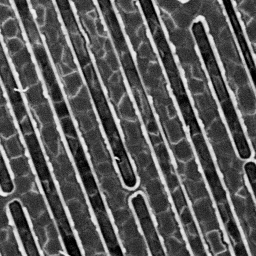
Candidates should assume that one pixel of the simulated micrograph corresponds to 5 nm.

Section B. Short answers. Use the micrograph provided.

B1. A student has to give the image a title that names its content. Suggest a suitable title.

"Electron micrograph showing parallel lines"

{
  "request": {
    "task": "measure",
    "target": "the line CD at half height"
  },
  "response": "130 nanometers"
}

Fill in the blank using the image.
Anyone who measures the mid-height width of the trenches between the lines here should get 64.9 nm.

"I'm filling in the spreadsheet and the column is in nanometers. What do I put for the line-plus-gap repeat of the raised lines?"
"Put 195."